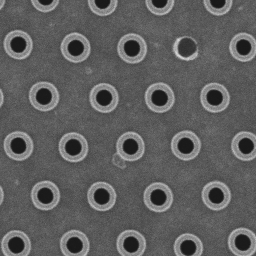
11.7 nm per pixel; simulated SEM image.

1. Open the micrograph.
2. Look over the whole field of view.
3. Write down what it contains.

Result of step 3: a regular array of ring-shaped raised bodies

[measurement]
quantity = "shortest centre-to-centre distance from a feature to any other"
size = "654 nanometers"